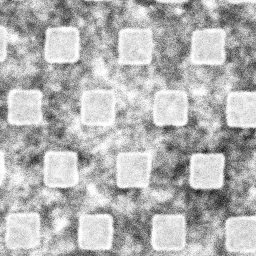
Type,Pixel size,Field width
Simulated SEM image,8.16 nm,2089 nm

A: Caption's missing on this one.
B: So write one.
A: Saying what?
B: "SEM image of a regular array of raised bodies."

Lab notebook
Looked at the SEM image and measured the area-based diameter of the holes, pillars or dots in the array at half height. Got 299 nm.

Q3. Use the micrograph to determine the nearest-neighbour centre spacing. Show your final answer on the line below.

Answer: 72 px